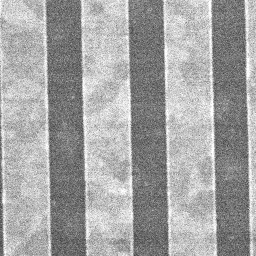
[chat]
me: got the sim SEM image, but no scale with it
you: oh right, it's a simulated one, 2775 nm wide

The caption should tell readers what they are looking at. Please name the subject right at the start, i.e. one or a few lines or trenches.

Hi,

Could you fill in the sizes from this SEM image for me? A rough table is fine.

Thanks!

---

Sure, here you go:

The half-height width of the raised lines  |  497 nanometres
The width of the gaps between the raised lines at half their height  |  392 nanometres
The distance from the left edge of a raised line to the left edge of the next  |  896 nanometres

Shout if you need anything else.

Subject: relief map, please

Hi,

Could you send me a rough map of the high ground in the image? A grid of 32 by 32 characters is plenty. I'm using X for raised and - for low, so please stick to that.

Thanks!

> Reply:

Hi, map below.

XXXXXX----XXXXXX-----XXXXX-----X
XXXXXX----XXXXXX-----XXXXX-----X
XXXXXX----XXXXXX-----XXXXX-----X
XXXXXX----XXXXXX-----XXXXX-----X
XXXXXX----XXXXXX-----XXXXX-----X
XXXXXX----XXXXXX-----XXXXX-----X
XXXXXX----XXXXXX-----XXXXX-----X
XXXXXX----XXXXXX-----XXXXX-----X
XXXXXX----XXXXXX-----XXXXX-----X
XXXXXX----XXXXXX-----XXXXX-----X
XXXXXX----XXXXXX-----XXXXX-----X
XXXXXX----XXXXXX-----XXXXX-----X
XXXXXX----XXXXXX-----XXXXX-----X
XXXXXX----XXXXXX-----XXXXXX----X
XXXXXX-----XXXXX-----XXXXXX----X
XXXXXX-----XXXXX-----XXXXXX----X
XXXXXX-----XXXXX-----XXXXXX----X
XXXXXX-----XXXXX-----XXXXXX----X
XXXXXX-----XXXXX-----XXXXXX----X
XXXXXX-----XXXXX-----XXXXXX----X
XXXXXX-----XXXXX-----XXXXXX----X
XXXXXX-----XXXXX-----XXXXXX----X
XXXXXX-----XXXXX-----XXXXXX----X
XXXXXX-----XXXXX-----XXXXXX----X
XXXXXX-----XXXXX-----XXXXXX----X
XXXXXX-----XXXXX-----XXXXXX----X
XXXXXX-----XXXXXX----XXXXXX----X
-XXXXX-----XXXXXX----XXXXXX----X
-XXXXX-----XXXXXX----XXXXXX----X
-XXXXX-----XXXXXX----XXXXXX----X
-XXXXX-----XXXXXX----XXXXXX----X
-XXXXX-----XXXXXX----XXXXXX----X